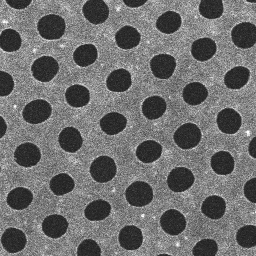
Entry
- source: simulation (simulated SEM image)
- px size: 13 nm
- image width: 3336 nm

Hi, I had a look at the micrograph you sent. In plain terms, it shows a regular array of holes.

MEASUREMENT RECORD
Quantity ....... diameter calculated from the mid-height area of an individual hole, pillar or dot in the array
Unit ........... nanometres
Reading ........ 324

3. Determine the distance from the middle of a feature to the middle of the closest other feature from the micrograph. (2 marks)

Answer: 554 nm